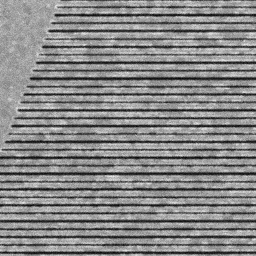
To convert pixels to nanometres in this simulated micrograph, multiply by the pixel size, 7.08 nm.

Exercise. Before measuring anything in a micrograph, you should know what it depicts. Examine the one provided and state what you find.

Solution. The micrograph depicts parallel lines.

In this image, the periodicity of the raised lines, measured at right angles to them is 56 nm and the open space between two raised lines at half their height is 19.5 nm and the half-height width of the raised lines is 38.9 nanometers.